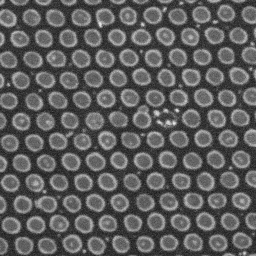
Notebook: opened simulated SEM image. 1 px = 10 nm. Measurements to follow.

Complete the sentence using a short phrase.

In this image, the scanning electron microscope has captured a regular array of raised bodies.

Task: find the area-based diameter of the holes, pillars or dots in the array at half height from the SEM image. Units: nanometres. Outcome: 159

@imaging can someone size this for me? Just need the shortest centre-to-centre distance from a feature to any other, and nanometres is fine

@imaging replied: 233